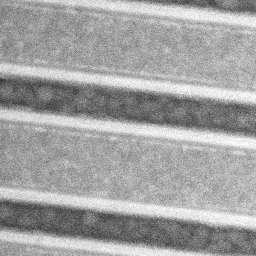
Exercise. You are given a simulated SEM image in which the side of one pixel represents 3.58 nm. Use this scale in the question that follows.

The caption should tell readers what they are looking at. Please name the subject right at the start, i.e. one or a few lines or trenches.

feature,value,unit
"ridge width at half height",0.28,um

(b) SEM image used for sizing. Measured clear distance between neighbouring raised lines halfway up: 160 nanometres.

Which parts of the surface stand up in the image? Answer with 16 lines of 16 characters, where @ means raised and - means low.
@@@@@@@@@-------
@@@@@@@@@@@@@@@@
@@@@@@@@@@@@@@@@
@@@@@@@@@@@@@@@@
--@@@@@@@@@@@@@@
-----------@@@@@
----------------
@@@@------------
@@@@@@@@@@@@----
@@@@@@@@@@@@@@@@
@@@@@@@@@@@@@@@@
@@@@@@@@@@@@@@@@
----@@@@@@@@@@@@
-------------@@@
----------------
@@@@@@@---------